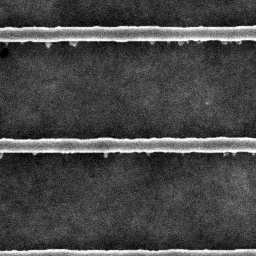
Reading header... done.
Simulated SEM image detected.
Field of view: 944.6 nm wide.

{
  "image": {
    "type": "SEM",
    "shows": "lines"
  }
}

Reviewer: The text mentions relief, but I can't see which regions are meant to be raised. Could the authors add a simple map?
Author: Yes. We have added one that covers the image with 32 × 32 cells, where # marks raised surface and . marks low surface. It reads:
................................
................................
................................
################################
################################
................................
................................
................................
................................
................................
................................
................................
................................
................................
................................
................................
................................
##...#####.#####################
################################
................................
................................
................................
................................
................................
................................
................................
................................
................................
................................
................................
................................
################################